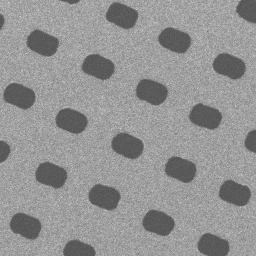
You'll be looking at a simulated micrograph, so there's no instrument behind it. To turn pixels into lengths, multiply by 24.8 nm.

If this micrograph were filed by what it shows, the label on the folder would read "a regular array of holes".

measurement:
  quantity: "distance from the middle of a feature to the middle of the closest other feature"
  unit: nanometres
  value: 1400